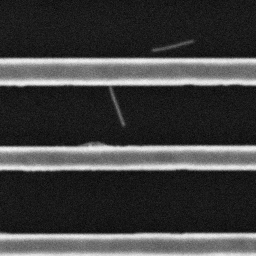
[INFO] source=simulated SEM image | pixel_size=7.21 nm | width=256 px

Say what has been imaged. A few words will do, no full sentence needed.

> lines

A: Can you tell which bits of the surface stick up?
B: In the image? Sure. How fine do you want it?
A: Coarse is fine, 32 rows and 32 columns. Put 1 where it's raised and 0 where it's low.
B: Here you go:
00000000000000000000000000000000
00000000000000000000000000000000
00000000000000000000000000000000
00000000000000000000000000000000
00000000000000000000000000000000
00000000000000000000000000000000
00000000000000000000000000000000
11111111111111111111111111111111
11111111111111111111111111111111
11111111111111111111111111111111
11111110011111111100000000000000
00000000000000000000000000000000
00000000000000000000000000000000
00000000000000000000000000000000
00000000000000000000000000000000
00000000000000000000000000000000
00000000000000000000000000000000
00000000000000000000000000000000
11111111111111111111111111111111
11111111111111111111111111111111
11111111111111111111111111111111
00000000000000000000000000000000
00000000000000000000000000000000
00000000000000000000000000000000
00000000000000000000000000000000
00000000000000000000000000000000
00000000000000000000000000000000
00000000000000000000000000000000
00000000000000000000000000000000
11111111111111111111111111111111
11111111111111111111111111111111
11111111111111111111111111111111